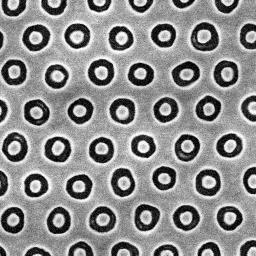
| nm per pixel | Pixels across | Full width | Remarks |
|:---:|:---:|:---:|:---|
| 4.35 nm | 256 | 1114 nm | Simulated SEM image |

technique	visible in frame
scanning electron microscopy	a regular array of ring-shaped grooves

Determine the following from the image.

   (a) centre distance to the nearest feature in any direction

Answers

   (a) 175 nanometers